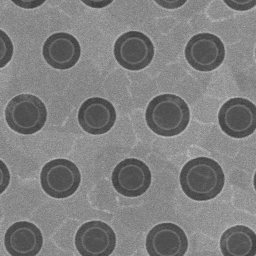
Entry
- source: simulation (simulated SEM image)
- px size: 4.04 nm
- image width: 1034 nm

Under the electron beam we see a regular array of ring-shaped grooves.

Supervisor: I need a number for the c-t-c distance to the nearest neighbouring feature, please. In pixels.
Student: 71.1